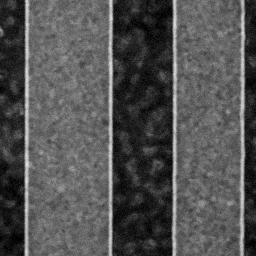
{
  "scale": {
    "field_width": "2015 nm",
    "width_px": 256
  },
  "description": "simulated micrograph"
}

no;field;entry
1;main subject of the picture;one or a few lines or trenches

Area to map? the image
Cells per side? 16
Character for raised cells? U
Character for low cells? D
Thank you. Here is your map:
DDUUUUUDDDDUUUUD
DDUUUUUDDDDUUUUD
DDUUUUUDDDDUUUUD
DDUUUUUDDDDUUUUD
DDUUUUUDDDDUUUUD
DDUUUUUDDDDUUUUD
DDUUUUUDDDDUUUUD
DDUUUUUDDDDUUUUD
DDUUUUUDDDDUUUUD
DDUUUUUDDDDUUUUD
DDUUUUUDDDDUUUUD
DDUUUUUDDDDUUUUD
DDUUUUUDDDDUUUUD
DDUUUUUDDDDUUUUD
DDUUUUUDDDDUUUUD
DDUUUUUDDDDUUUUD